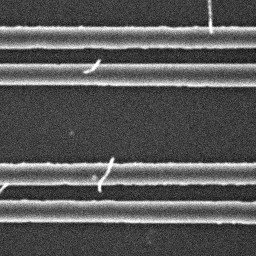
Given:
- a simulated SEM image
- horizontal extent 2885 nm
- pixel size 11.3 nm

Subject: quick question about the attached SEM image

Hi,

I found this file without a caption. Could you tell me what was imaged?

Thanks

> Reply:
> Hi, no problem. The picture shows lines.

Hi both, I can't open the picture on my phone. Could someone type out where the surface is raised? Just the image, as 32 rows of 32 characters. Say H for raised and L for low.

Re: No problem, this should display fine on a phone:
LLLLLLLLLLLLLLLLLLLLLLLLLLLLLLLL
LLLLLLLLLLLLLLLLLLLLLLLLLLLLLLLL
LLLLLLLLLLLLLLLLLLLLLLLLLLLLLLLL
HHHHHHHHHHHHHHHHHHHHHHHHHHHHHHHH
HHHHHHHHHHHHHHHHHHHHHHHHHHHHHHHH
HHHHHHHHHHHHHHHHHHHHHHHHHHHHHHHH
LLLLLLLLLLLLLLLLLLLLLLLLLLLLLLLL
LLLLLLLLLLLLLLLLLLLLLLLLLLLLLLLL
HHHHHHHHHHHHHHHHHHHHHHHHHHHHHHHH
HHHHHHHHHHHHHHHHHHHHHHHHHHHHHHHH
HHHHHHHHHHHHHHHHHHHHHHHHHHHHHHHH
LLLLLLLLLLLLLLLLLLLLLLLLLLLLLLLL
LLLLLLLLLLLLLLLLLLLLLLLLLLLLLLLL
LLLLLLLLLLLLLLLLLLLLLLLLLLLLLLLL
LLLLLLLLLLLLLLLLLLLLLLLLLLLLLLLL
LLLLLLLLLLLLLLLLLLLLLLLLLLLLLLLL
LLLLLLLLLLLLLLLLLLLLLLLLLLLLLLLL
LLLLLLLLLLLLLLLLLLLLLLLLLLLLLLLL
LLLLLLLLLLLLLLLLLLLLLLLLLLLLLLLL
LLLLLLLLLLLLLLLLLLLLLLLLLLLLLLLL
LLLLLHLLLLHLHHHLHHLLLHLHHHLHHHHH
HHHHHHHHHHHHHHHHHHHHHHHHHHHHHHHH
HHHHHHHHHHHHHHHHHHHHHHHHHHHHHHHH
LLLLLLLLLLLLLLLLLLLLLLLLLLLLLLLL
LLLLLLLLLLLLLLLLLLLLLLLLLLLLLLLL
HHHHHHHHHHHHHHHHHHHHHHHHHHHHHHHH
HHHHHHHHHHHHHHHHHHHHHHHHHHHHHHHH
HHHHHHHHHHHHHHHHHHHHHHHHHHHHHHHH
LLLLLLLLLLLLLLLLLLLLLLLLLLLLLLLL
LLLLLLLLLLLLLLLLLLLLLLLLLLLLLLLL
LLLLLLLLLLLLLLLLLLLLLLLLLLLLLLLL
LLLLLLLLLLLLLLLLLLLLLLLLLLLLLLLL